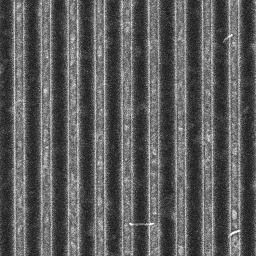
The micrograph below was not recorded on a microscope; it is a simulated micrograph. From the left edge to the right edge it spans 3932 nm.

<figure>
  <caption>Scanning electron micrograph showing parallel lines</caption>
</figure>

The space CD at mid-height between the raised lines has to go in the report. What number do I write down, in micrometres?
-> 0.14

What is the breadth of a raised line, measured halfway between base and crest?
280 nanometers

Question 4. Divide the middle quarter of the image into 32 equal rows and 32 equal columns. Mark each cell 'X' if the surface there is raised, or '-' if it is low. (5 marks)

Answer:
X--XXXXX--XXXX---XXXX---XXXX--XX
X--XXXXX--XXXX---XXXX---XXXX--XX
X--XXXXX--XXXX---XXXX---XXXX--XX
X--XXXXX--XXXX---XXXX---XXXX--XX
X--XXXXX--XXXX---XXXX---XXXX--XX
X--XXXXX--XXXX---XXXX---XXXX--XX
X--XXXXX--XXXX---XXXX---XX-X--XX
X--XXXXX--XXXX---XXXX---XXXX--XX
X--XXXXX--XXXX---XXXX---XXXX--XX
X--XXXXX--XXXX---XXXX---XXXX--XX
X--XXXXX--XXXX---XX-X---XXXX--XX
X---XXXX--XXXX---X--X----XXX--XX
X---XXXX--XXXX---XX-X---XXXX--XX
X---XXXX--XXXX---XXXX---XXXX--XX
X---XXXX--XXXX---XXXX---XXXX--XX
X---XXXX--XXXX---XXXX---XXXX--XX
X---XXXX--XXXX---XXXX---XXXX--XX
X---XXXX--XXXX---XXXX---XXXX--XX
X---XXXX--XXXX---XXXX---XXXX--XX
X---XXXX--XXXX---XXXX---X-XX--XX
X---XXXX--XXX----XXXX---XXXX--XX
X---XXXX--XXX----XXXX---XXXX--XX
X---XXXX--XXXX---XXXX---XXXX---X
X---XXXX--XXXX---XXXX---XXXX---X
X---XXXX--XXXX---XXXX---XXXX---X
X---XXXX--XXXX---XXXX---XXXX---X
X---XXXX--XXXXX--XXXX---XXXX---X
X---XXXX--XXXXX--XXXX---XXXX---X
X---XXXX--XXXXX--XXXX---XXXX---X
X---XXXX--XXXXX--XXXX---XXXX---X
X---XXXX--XXXXX--XXXX---XXXX---X
X---XXXX--XXXXX--XXXX---XXXX---X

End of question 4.